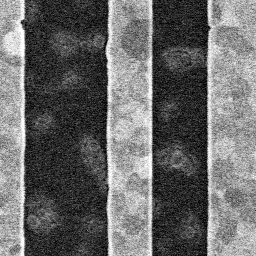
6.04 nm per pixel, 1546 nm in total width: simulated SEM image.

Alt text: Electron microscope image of one or a few lines or trenches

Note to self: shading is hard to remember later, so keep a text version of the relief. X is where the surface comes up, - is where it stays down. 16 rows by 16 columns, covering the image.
X------XX----XXX
X------XX----XXX
X------XX----XXX
X------XX----XXX
X------XX----XXX
X------XX----XXX
X------XX----XXX
X------XX----XXX
X------XX----XXX
X------XX----XXX
X------XX----XXX
X------XX----XXX
X------XX----XXX
X------XX----XXX
X------XX----XXX
X------XX----XXX